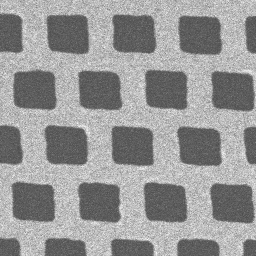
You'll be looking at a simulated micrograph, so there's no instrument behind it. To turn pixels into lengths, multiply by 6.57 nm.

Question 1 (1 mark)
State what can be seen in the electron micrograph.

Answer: a regular array of holes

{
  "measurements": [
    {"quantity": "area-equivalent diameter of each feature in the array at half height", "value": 0.291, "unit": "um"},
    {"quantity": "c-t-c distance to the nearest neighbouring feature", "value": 424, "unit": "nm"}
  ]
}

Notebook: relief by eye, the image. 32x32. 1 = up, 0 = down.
11111111111111111111111111111111
11111111111111111111111111111111
00011100000111000001110000011110
00011100000111000001110000001110
00011100000111000001110000001110
00011100000111000000110000001110
11111110000111100001111000001110
11111111111111111111111111111111
11111111111111111111111111111111
11000001110000011100000111000001
11000001110000011100000111000000
11000001110000011100000111100000
11000001110000011100000111000000
11100001111000011111000111100000
11111111111111111111111111111111
11111111111111111111111111111111
00011100000111000001110000011100
00011100000111000001110000001100
00011100000111000001110000001110
00011100000111000001110000001110
10111110001111100001111000001111
11111111111111111111111111111111
11111111111111111111111111111111
10000001110000011100000111000001
11000001110000011100000111000000
11000001110000011100000111000000
11000001110000011100000111000000
11100011110000011110000111100000
11111111111111111111111111111111
11111111111111111111111111111111
00111100000111000001110000011100
00011100000111000001110000011100